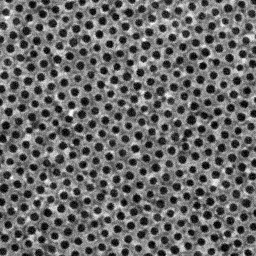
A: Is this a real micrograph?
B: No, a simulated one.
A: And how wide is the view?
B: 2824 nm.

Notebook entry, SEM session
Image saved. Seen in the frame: a regular array of holes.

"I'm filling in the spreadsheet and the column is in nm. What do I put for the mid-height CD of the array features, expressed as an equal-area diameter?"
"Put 104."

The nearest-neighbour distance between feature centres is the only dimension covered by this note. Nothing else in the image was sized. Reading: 148 nm